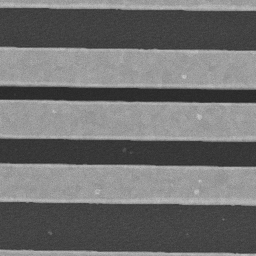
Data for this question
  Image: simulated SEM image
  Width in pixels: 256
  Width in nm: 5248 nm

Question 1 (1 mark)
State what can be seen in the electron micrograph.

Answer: lines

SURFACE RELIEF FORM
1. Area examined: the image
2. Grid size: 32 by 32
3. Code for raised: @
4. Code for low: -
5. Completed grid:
@@@@@@@@@@@@@@@@@@@@@@@@@@@@@@@@
--------------------------------
--------------------------------
--------------------------------
--------------------------------
--------------------------------
@@@@@@@@@@@@@@@@@@@@@@@@@@@@@@@@
@@@@@@@@@@@@@@@@@@@@@@@@@@@@@@@@
@@@@@@@@@@@@@@@@@@@@@@@@@@@@@@@@
@@@@@@@@@@@@@@@@@@@@@@@@@@@@@@@@
@@@@@@@@@@@@@@@@@@@@@@@@@@@@@@@@
--------------------------------
--------------------------------
@@@@@@@@@@@@@@@@@@@@@@@@@@@@@@@@
@@@@@@@@@@@@@@@@@@@@@@@@@@@@@@@@
@@@@@@@@@@@@@@@@@@@@@@@@@@@@@@@@
@@@@@@@@@@@@@@@@@@@@@@@@@@@@@@@@
------------------@@@@@@@@@@@@@@
--------------------------------
--------------------------------
--------------------------------
@@@@@@@@@@@@@@@@@@@@@@@@@@@@@@@@
@@@@@@@@@@@@@@@@@@@@@@@@@@@@@@@@
@@@@@@@@@@@@@@@@@@@@@@@@@@@@@@@@
@@@@@@@@@@@@@@@@@@@@@@@@@@@@@@@@
--------------------------@@@@@@
--------------------------------
--------------------------------
--------------------------------
--------------------------------
--------------------------------
@@@@@@@@@@@@--------------------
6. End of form